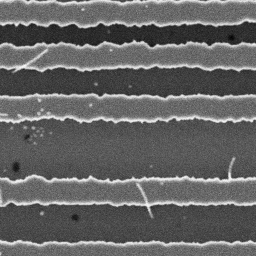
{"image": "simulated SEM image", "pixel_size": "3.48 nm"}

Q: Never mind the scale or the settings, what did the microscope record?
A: lines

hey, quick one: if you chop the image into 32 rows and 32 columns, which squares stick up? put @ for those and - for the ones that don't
@@@@@@@@@@@@@@@@@@@@@@@@@@@@@@@@
@@@@@@@@@@@@@@@@@@@@@@@@@@@@@@@@
@@@@@@@@@@@@@@@@@@@@@@@@@@@@@@@@
--------------------------------
--------------------------------
@----@-@@----@--@@-----@@@-@@-@@
@@@@@@@@@@@@@@@@@@@@@@@@@@@@@@@@
@@@@@@@@@@@@@@@@@@@@@@@@@@@@@@@@
@@@@@@@-@@@@@@@----------@@@@@@@
--------------------------------
--------------------------------
--------------------------------
@@@@@@@@@@@@@@@@@@@@@@@@@@@@@@@@
@@@@@@@@@@@@@@@@@@@@@@@@@@@@@@@@
@@@@@@@@@@@@@@@@@@@@@@@@@@@@@@@@
--------------------------------
--------------------------------
--------------------------------
--------------------------------
--------------------------------
--------------------------------
--------------------------------
@-@@@@@@@@@@@---@@@@@@@@@@@@@@@@
@@@@@@@@@@@@@@@@@@@@@@@@@@@@@@@@
@@@@@@@@@@@@@@@@@@@@@@@@@@@@@@@@
@-@@-@-@@@@@@-@@@@@@--@@@@@@@@@@
--------------------------------
--------------------------------
--------------------------------
--------------------------------
@@@@@@@@@@@@@@@@@@@@@@@@@@@@@@@@
@@@@@@@@@@@@@@@@@@@@@@@@@@@@@@@@